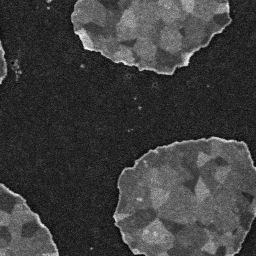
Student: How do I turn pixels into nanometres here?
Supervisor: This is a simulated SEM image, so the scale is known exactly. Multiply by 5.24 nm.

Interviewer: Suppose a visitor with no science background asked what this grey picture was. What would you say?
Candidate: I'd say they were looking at raised bodies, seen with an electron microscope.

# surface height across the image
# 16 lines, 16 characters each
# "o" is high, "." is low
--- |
.....ooooooooo..
.....ooooooooo..
.....oooooooo...
.......ooooo....
..........o.....
................
................
................
................
.........ooooooo
........oooooooo
.......ooooooooo
o......ooooooooo
oo.....ooooooooo
ooo.....oooooooo
oooo....ooooooo.